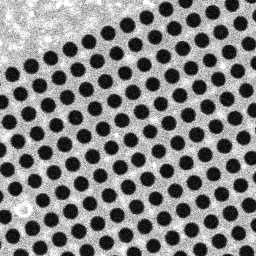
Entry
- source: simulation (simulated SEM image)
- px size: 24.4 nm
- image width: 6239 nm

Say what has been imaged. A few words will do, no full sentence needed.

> a regular array of holes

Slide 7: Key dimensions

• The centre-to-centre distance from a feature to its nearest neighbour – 505 nm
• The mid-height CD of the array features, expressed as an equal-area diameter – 383 nanometres